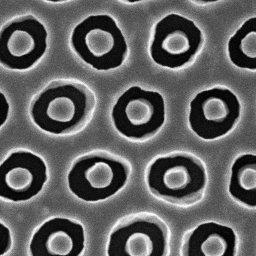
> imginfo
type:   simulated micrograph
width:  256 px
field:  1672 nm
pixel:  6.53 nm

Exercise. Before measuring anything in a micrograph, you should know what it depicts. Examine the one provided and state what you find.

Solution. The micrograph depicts ring-shaped grooves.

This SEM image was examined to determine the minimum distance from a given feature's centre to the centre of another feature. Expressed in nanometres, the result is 490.